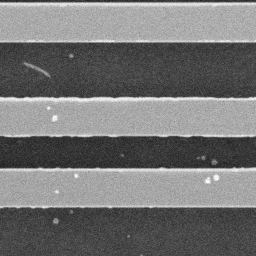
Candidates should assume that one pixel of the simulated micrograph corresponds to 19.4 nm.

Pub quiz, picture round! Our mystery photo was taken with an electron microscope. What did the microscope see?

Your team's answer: lines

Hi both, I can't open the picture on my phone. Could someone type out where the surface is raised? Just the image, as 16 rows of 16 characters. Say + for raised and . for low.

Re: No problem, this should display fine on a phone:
++++++++++++++++
++++++++++++++++
++++++++++++++++
................
................
................
++++++++++++++++
++++++++++++++++
++.+++++..++++++
................
................
++++++++++++++++
++++++++++++++++
................
................
................